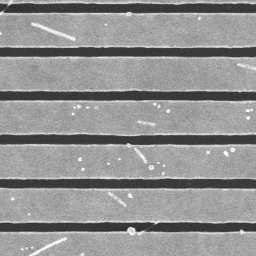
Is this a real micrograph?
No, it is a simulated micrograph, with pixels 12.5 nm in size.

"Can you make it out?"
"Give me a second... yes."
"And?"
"lines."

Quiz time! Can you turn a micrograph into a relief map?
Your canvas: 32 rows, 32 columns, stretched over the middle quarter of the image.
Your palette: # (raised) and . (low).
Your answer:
################################
################################
################################
################################
################################
################################
################################
................................
................................
################################
################################
################################
################################
################################
################################
################################
################################
###..###########################
................................
................................
################################
################################
################################
################################
################################
################################
################################
################################
################################
................................
................................
################################